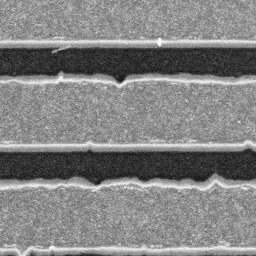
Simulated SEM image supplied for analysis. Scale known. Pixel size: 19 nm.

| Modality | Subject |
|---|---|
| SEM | one or a few lines or trenches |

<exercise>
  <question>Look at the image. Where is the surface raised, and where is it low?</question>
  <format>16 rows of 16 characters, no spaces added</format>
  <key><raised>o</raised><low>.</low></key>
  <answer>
oooooooooooooooo
oooooooooooooooo
oooooooooooooooo
................
................
oooooooooooooooo
oooooooooooooooo
oooooooooooooooo
oooooooooooooooo
................
................
.oooo..oooo..o..
oooooooooooooooo
oooooooooooooooo
oooooooooooooooo
oooooooooooooooo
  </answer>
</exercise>